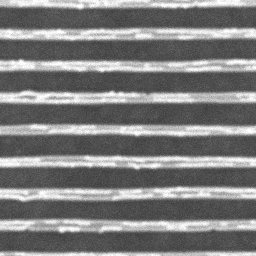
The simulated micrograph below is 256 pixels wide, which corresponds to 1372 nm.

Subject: parallel lines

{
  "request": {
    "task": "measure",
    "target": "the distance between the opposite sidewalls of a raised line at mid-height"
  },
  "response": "8.51 px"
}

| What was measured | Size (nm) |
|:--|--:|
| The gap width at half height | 125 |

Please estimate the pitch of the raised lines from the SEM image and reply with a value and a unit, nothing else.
171 nm